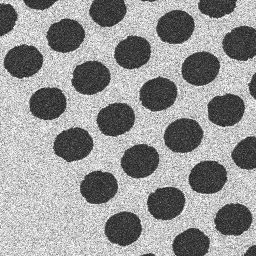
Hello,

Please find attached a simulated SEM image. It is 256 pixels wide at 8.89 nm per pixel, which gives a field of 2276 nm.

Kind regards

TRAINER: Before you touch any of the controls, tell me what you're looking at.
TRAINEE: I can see a regular array of holes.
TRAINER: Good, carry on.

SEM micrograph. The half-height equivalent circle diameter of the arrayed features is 322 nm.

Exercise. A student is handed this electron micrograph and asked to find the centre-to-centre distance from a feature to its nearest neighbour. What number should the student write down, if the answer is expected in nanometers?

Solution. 431